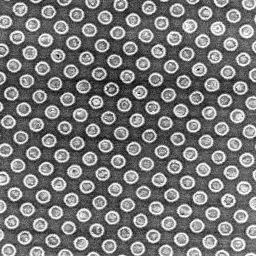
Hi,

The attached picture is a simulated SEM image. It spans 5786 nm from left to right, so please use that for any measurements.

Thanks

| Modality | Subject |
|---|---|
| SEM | a regular array of raised bodies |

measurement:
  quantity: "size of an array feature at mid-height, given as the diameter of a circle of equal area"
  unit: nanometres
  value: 276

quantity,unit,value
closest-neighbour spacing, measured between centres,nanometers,449